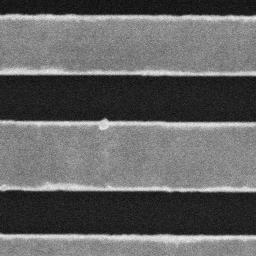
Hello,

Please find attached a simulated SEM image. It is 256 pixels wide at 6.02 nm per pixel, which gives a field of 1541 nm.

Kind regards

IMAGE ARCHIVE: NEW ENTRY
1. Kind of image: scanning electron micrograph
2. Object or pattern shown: lines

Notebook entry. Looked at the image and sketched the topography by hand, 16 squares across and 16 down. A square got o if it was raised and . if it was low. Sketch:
................
oooooooooooooooo
oooooooooooooooo
oooooooooooooooo
oooooooooooooooo
................
................
................
oooooooooooooooo
oooooooooooooooo
oooooooooooooooo
oooooooooooooooo
................
................
................
oooooooooooooooo